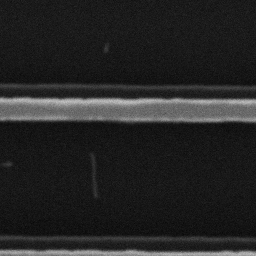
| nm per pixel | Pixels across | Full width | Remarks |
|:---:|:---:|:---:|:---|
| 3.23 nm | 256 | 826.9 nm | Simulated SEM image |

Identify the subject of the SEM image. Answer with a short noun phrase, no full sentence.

lines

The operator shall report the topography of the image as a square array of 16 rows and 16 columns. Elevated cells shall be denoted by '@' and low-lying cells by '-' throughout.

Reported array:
----------------
----------------
----------------
----------------
----------------
@@@@@@@@@@@@@@@@
@@@@@@@@@@@@@@@@
-----------@@@-@
----------------
----------------
----------------
----------------
----------------
----------------
----------------
@@@@@@@@@@@@@@@@